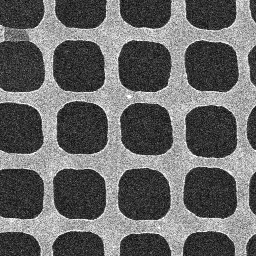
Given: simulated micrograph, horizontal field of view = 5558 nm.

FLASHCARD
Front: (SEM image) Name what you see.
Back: a regular array of holes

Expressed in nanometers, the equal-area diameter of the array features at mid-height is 1200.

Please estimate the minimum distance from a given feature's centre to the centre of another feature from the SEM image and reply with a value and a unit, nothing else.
1370 nm